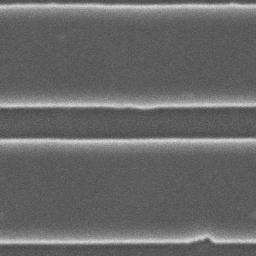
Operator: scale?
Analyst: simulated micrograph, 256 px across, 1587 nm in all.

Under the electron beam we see one or a few lines or trenches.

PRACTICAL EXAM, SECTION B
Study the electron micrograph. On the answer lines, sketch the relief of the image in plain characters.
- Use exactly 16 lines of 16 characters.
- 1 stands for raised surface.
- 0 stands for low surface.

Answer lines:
1111111111111111
1111111111111111
1111111111111111
1111111111111111
1111111111111111
1111111111111111
1111111111111111
0000000000000000
0000000000000000
1111111111111111
1111111111111111
1111111111111111
1111111111111111
1111111111111111
1111111111111111
0000000000000000